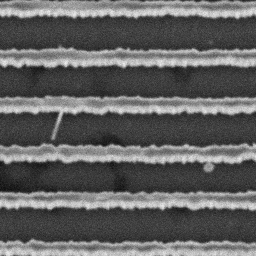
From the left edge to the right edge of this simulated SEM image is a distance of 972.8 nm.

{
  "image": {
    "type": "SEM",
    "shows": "lines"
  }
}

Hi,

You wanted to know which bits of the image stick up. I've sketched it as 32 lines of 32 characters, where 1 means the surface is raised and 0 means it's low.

11111111111111111111111111111111
11111111111111111111111111111111
00000000000000000000000000000000
00000000000000000000000000000000
00000000000000000000000000000000
00000000000000000000000000000000
11111111111011111111111110111111
11111111111111111111111111111111
00000000000000000000000000000000
00000000000000000000000000000000
00000000000000000000000000000000
00000000000000000000000000000000
11111111111111111111111111111111
11111111111111111111111111111111
00000000000000000000000000000000
00000000000000000000000000000000
00000000000000000000000000000000
00000000000000000000000000000000
11111111111111111111111111111111
11111111111111111111111111111111
00000000000000000000000000000000
00000000000000000000000000000000
00000000000000000000000000000000
00000000000000000000000000000000
11111111111111111111111111111111
11111111111111111111111111111111
00000000000000000000000000000000
00000000000000000000000000000000
00000000000000000000000000000000
00000000000000000000000000000000
11111111111111011111111111111110
11111111111111111111111111111111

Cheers